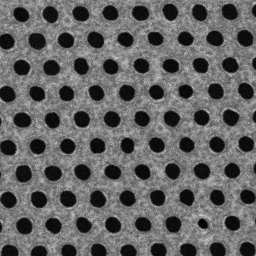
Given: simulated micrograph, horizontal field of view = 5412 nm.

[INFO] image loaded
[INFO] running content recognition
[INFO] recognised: a regular array of holes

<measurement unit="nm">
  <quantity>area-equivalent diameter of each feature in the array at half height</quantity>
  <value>347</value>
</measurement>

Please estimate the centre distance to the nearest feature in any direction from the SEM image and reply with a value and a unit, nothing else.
623 nm